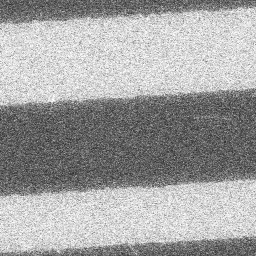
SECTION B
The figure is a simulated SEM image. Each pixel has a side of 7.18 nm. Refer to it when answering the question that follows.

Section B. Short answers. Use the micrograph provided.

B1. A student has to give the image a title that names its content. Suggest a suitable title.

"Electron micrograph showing one or a few lines or trenches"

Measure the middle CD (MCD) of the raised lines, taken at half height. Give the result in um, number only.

0.668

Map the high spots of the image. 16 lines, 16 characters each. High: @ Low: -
@@@@@@@@@@@@@@@@
@@--------------
----------------
----------------
----------------
----------------
@@@@@@@@@@@@@@@@
@@@@@@@@@@@@@@@@
@@@@@@@@@@@@@@@@
@@@@@@@@@@@@@@@@
@@@@@@@@@@@@@@@@
@@@@@@@@@@@@@---
----------------
----------------
----------------
----@@@@@@@@@@@@